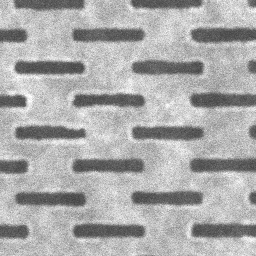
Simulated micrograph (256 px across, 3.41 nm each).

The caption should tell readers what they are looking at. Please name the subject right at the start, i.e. a regular array of holes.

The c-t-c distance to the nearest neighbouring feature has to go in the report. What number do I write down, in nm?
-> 222